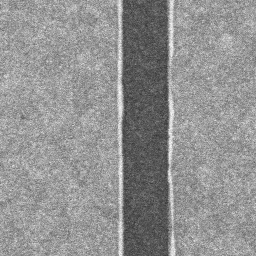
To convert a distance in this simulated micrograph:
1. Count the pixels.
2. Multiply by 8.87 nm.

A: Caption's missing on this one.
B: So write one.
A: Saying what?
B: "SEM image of one or a few lines or trenches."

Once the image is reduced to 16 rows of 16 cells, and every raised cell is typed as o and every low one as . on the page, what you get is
ooooooo....ooooo
ooooooo....ooooo
ooooooo....ooooo
ooooooo....ooooo
ooooooo....ooooo
ooooooo....ooooo
oooooooo...ooooo
ooooooo....ooooo
oooooooo...ooooo
oooooooo...ooooo
oooooooo...ooooo
oooooooo...ooooo
oooooooo...ooooo
oooooooo...ooooo
oooooooo...ooooo
oooooooo...ooooo